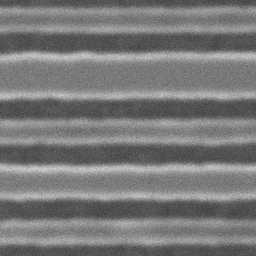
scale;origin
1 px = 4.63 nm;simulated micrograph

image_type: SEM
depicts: lines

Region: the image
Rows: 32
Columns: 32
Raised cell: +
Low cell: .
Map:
................................
++++++++++++++++++++++++++++++++
++++++++++++++++++++++++++++++++
++++++++++++++++++++++++++++++++
................................
................................
................................
++++++++++++++++++++++++++++++++
++++++++++++++++++++++++++++++++
++++++++++++++++++++++++++++++++
++++++++++++++++++++++++++++++++
++++++++++++++++++++++++++++++++
................................
................................
................................
++++++++++++++++++++++++++++++++
++++++++++++++++++++++++++++++++
++++++++++++++++++++++++++++++++
................................
................................
................................
++++++++++++++++++++++++++++++++
++++++++++++++++++++++++++++++++
++++++++++++++++++++++++++++++++
++++++++++++++++++++++++++++++++
................................
................................
.....................++.........
++++++++++++++++++++++++++++++++
++++++++++++++++++++++++++++++++
....++............+.............
................................